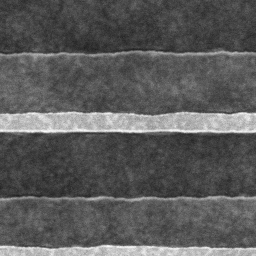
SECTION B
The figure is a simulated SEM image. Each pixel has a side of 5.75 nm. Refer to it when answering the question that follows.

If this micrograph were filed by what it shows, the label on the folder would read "lines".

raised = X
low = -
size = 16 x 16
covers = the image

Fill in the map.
----------------
----------------
----------------
XXXXXXXXXXXXXXXX
XXXXXXXXXXXXXXXX
XXXXXXXXXXXXXXXX
XXXXXXXXXXXXXXXX
XXXXXXXXXXXXXXXX
----------------
----------------
----------------
----------------
XXXXXXXXXXXXXXXX
XXXXXXXXXXXXXXXX
XXXXXXXXXXXXXXXX
XXXXXXXXXXXXXXXX